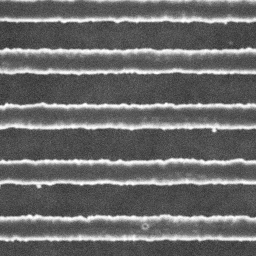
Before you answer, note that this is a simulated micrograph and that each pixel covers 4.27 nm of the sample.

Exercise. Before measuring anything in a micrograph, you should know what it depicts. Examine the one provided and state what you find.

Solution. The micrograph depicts lines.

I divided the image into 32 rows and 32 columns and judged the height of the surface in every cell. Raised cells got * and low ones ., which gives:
********************************
********************************
********************************
................................
................................
................................
********************************
********************************
********************************
................................
................................
................................
................................
********************************
********************************
********************************
................................
................................
................................
................................
********************************
********************************
********************************
................................
................................
................................
................................
********************************
********************************
********************************
................................
................................